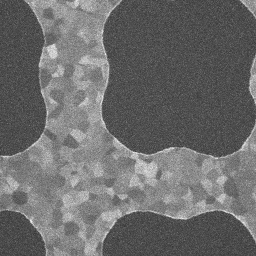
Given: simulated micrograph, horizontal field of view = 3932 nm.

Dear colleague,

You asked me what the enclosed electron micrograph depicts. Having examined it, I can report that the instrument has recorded holes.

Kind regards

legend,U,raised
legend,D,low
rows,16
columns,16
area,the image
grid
DDUUUUUDDDDDDDDU
DDDUUUUDDDDDDDDD
DDDUUUDDDDDDDDDD
DDDUUUUDDDDDDDDD
DDUUUUUDDDDDDDDD
DDDUUUUDDDDDDDDD
DDDUUUDDDDDDDDDD
DDDUUUDDDDDDDDDD
DDDUUUUDDDDDDDDD
DUUUUUUUDDUUDDDU
UUUUUUUUUUUUUUUU
UUUUUUUUUUUUUUUU
UUUUUUUUUUUUUUUU
DDUUUUUUDDUUDDDU
DDUUUUUDDDDDDDDD
DDDUUUDDDDDDDDDD